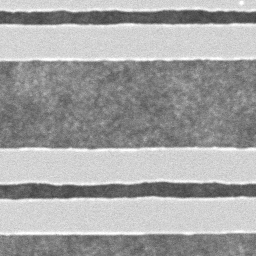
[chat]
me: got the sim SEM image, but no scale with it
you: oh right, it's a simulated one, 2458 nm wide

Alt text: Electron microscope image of lines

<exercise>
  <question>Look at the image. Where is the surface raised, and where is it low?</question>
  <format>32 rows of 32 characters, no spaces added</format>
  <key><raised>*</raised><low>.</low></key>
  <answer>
********************************
................................
................................
********************************
********************************
********************************
********************************
****.*****************..........
................................
................................
................................
................................
................................
................................
................................
................................
................................
................................
....................*...*.*.....
********************************
********************************
********************************
********************************
................................
................................
********************************
********************************
********************************
********************************
................................
................................
................................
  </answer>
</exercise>